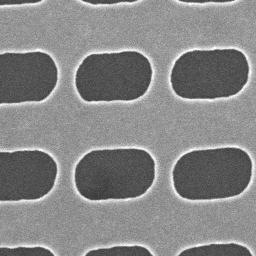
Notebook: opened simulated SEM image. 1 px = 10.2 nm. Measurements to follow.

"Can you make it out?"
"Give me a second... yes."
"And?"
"holes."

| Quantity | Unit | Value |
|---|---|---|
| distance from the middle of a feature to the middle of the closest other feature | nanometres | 988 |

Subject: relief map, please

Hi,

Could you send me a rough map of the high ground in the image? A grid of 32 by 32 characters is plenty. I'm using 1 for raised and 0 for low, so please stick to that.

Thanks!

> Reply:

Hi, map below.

00001111111000111111111111111111
11111111111111111111111111111111
11111111111111111111111111111111
11111111111111111111111111111111
11111111111111111111111111111111
11111111111111111111111111111111
11110111111111100111111100000011
00000001110000000001110000000001
00000001110000000001110000000001
00000001100000000001100000000001
00000001100000000001100000000001
00000011110000000011110000000011
00000111111000000111111111111111
11111111111111111111111111111111
11111111111111111111111111111111
11111111111111111111111111111111
11111111111111111111111111111111
11111111111111111111111111111111
11111111111111100111111111100111
00000011110000000001111000000001
00000001110000000001110000000001
00000001100000000001110000000000
00000001100000000001110000000001
00000001110000000001110000000001
00000111110000000011111000000111
11111111111111111111111111111111
11111111111111111111111111111111
11111111111111111111111111111111
11111111111111111111111111111111
11111111111111111111111111111111
11111111111111111111111111100011
00000011111000000001111000000001